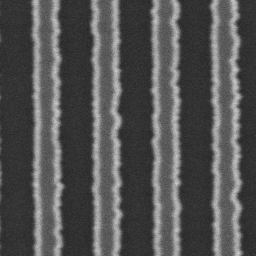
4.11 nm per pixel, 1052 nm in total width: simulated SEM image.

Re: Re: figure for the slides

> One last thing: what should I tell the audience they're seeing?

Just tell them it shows lines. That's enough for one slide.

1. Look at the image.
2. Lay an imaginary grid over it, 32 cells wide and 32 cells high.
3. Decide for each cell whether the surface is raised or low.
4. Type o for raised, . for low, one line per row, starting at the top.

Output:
....ooo.....ooo....ooo....oooo..
....ooo.....ooo....ooo....oooo..
....ooo.....ooo....ooo.....ooo..
....ooo.....ooo....ooo.....ooo..
....ooo.....ooo....ooo....oooo..
....ooo.....ooo....ooo....oooo..
....ooo.....ooo....ooo.....ooo..
....oooo....ooo....ooo.....ooo..
....ooo.....ooo....ooo.....ooo..
....ooo.....ooo....ooo.....ooo..
....ooo.....ooo....ooo.....ooo..
....ooo.....ooo....ooo.....ooo..
....ooo.....ooo....ooo.....ooo..
....ooo.....ooo....ooo.....ooo..
....ooo.....ooo....ooo.....ooo..
....ooo.....ooo....ooo.....ooo..
....ooo.....ooo....ooo.....ooo..
....ooo.....ooo....ooo.....ooo..
....oooo....ooo....ooo.....ooo..
....oooo....ooo....ooo.....ooo..
....oooo....ooo....ooo.....ooo..
....oooo....ooo....ooo.....ooo..
....oooo....ooo....ooo.....ooo..
....oooo....ooo....ooo.....ooo..
....ooo.....ooo....ooo.....ooo..
....ooo.....ooo....ooo.....ooo..
....ooo.....ooo....ooo.....ooo..
....oooo....ooo....ooo.....ooo..
....oooo....ooo....ooo.....ooo..
....oooo....ooo....ooo.....ooo..
....oooo....ooo....ooo.....ooo..
....oooo....ooo....ooo.....ooo..